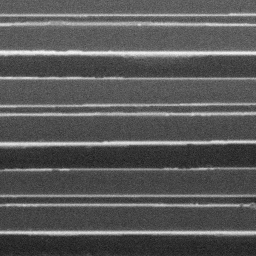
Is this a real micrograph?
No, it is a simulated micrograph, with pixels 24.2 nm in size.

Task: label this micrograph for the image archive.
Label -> lines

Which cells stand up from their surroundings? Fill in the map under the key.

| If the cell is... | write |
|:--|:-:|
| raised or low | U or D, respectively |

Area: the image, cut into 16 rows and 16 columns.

UUUUUUUUUUUUUUUU
UUUUUUUUUUUUUUUU
UUUUUUUUUUUUUUUU
DDDDDDDDDDDDDDDD
DDDDDDDDDDDDDDDD
UUUUUUUUUUUUUUUU
UUUUUUUUUUUUUUUU
UUUUUUUUUUUUUUUU
UUUUUUUUUUUUUUUU
DDDDDDDDDDDDDDDD
DDDDDDDDDDDDDDDD
UUUUUUUUUUUUUUUU
UUUUUUUUUUUUUUUU
UUUUUUUUUUUUUUUU
UUUUUUUUDDDDUDUU
DDDDDDDDDDDDDDDD